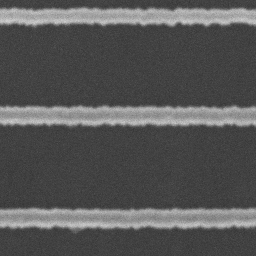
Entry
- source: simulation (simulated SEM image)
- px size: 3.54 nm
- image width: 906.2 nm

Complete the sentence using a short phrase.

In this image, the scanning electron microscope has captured lines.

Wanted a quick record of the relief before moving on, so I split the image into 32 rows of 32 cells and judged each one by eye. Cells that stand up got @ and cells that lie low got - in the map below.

--------------------------------
@@@@@@@@@@@@@@@@@@@@@@@@@@@@@@@@
@@@@@@@@@@@@@@@@@@@@@@@@@@@@@@@@
--------------------------------
--------------------------------
--------------------------------
--------------------------------
--------------------------------
--------------------------------
--------------------------------
--------------------------------
--------------------------------
--------------------------------
@@@@@@@@@@@@@@@@@@@@@@@@@@@-@@-@
@@@@@@@@@@@@@@@@@@@@@@@@@@@@@@@@
@@@@@-@-@@@@@@@@@@-@@@@@@@@@@@@@
--------------------------------
--------------------------------
--------------------------------
--------------------------------
--------------------------------
--------------------------------
--------------------------------
--------------------------------
--------------------------------
--------------------------------
@@@@@@@@@@@@@@@@@@@@@@@@@@@@@@@@
@@@@@@@@@@@@@@@@@@@@@@@@@@@@@@@@
-------------@------------------
--------------------------------
--------------------------------
--------------------------------